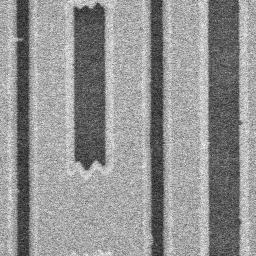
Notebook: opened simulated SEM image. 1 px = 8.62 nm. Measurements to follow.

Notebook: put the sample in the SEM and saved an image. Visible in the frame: one or a few lines or trenches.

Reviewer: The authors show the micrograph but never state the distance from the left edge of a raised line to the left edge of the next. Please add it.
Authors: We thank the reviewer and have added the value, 577 nm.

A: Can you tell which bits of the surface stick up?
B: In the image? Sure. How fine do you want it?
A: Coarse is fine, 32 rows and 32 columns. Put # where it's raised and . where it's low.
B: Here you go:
#...#####....#####...####.....##
#...#####.....####...####.....##
#...#####.....####...####.....##
##..#####.....####...####.....##
##..#####.....####...####.....##
##..#####.....####...####.....##
##..#####.....####...####.....##
##..#####.....####...####.....##
##..#####.....####...####.....##
##..#####.....####...####.....##
##..#####.....####...#####....##
##..#####.....####...####.....##
##..#####.....####...####.....##
##..#####.....####...####.....##
##..#####.....####...####.....##
##..#####.....####...####......#
##..#####.....####...####.....##
##..#####.....####...#####.....#
##..#####.....####...####......#
##..#####.....####...####......#
##..#####.....####...####......#
##..##############...####......#
##..##############...####......#
##..##############...####......#
##..##############...####......#
##..##############...####......#
##..##############...####......#
##..##############...####......#
##..##############...####......#
##..###############..#####.....#
##..###############..#####.....#
##..##############...#####.....#